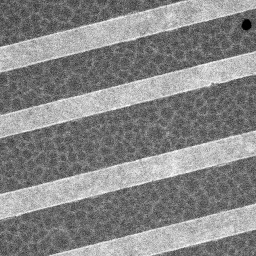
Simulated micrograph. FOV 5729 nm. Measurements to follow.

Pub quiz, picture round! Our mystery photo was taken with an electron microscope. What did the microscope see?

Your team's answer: one or a few lines or trenches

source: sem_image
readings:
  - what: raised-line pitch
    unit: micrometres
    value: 1.61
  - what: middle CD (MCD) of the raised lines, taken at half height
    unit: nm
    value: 521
